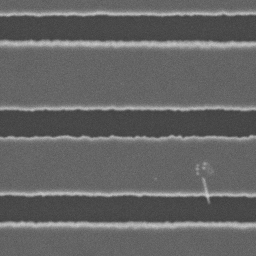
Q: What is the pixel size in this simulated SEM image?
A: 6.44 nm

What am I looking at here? lines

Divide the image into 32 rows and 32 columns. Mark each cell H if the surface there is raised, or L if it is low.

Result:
HHHHHHHHHHHHHHHHHHHHHHHHHHHHHHHH
HHHHHHHHHHHHHHHHHHHHHHHHHHHHHHHH
LLLLLLLLLLLLLLLLLLLLLLLLLLLLLLLL
LLLLLLLLLLLLLLLLLLLLLLLLLLLLLLLL
LLLLLLLLLLLLLLLLLLLLLLLLLLLLLLLL
HHHHHHHHHHHHHHHHHHHHHHHHHHHHHHHH
HHHHHHHHHHHHHHHHHHHHHHHHHHHHHHHH
HHHHHHHHHHHHHHHHHHHHHHHHHHHHHHHH
HHHHHHHHHHHHHHHHHHHHHHHHHHHHHHHH
HHHHHHHHHHHHHHHHHHHHHHHHHHHHHHHH
HHHHHHHHHHHHHHHHHHHHHHHHHHHHHHHH
HHHHHHHHHHHHHHHHHHHHHHHHHHHHHHHH
HHHHHHHHHHHHHHHHHHHHHHHHHHHHHHHH
HHHHHHHHHHHHHHHHHHHHHHHHHHHHHHHH
LLLLLLLLLLLLLLLLLLLLLLLLLLLLLLLL
LLLLLLLLLLLLLLLLLLLLLLLLLLLLLLLL
LLLLLLLLLLLLLLLLLLLLLLLLLLLLLLLL
HHHHHHHHHHHHHHHHHHHHHHHHHHHHHHHH
HHHHHHHHHHHHHHHHHHHHHHHHHHHHHHHH
HHHHHHHHHHHHHHHHHHHHHHHHHHHHHHHH
HHHHHHHHHHHHHHHHHHHHHHHHHHHHHHHH
HHHHHHHHHHHHHHHHHHHHHHHHHHHHHHHH
HHHHHHHHHHHHHHHHHHHHHHHHHHHHHHHH
HHHHHHHHHHHHHHHHHHHHHHHHHHHHHHHH
LLLHLLLLLLLLLHLLLHLHHHHHHHHHHHHH
LLLLLLLLLLLLLLLLLLLLLLLLLLLLLLLL
LLLLLLLLLLLLLLLLLLLLLLLLLLLLLLLL
LLLLLLLLLLLLLLLLLLLLLLLLLLLLLLLL
HHHHHHHHHHHHHHHHHHHHHHHHHHHHHHHH
HHHHHHHHHHHHHHHHHHHHHHHHHHHHHHHH
HHHHHHHHHHHHHHHHHHHHHHHHHHHHHHHH
HHHHHHHHHHHHHHHHHHHHHHHHHHHHHHHH